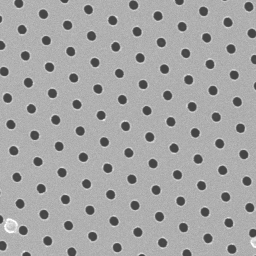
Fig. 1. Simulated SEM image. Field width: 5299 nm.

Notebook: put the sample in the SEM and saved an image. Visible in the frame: a regular array of holes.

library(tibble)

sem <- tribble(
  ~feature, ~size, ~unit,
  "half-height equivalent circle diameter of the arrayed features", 191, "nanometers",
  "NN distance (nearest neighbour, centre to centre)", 0.539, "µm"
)